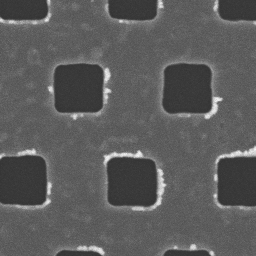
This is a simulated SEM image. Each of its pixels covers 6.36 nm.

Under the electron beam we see holes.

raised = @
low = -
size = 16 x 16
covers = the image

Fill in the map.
---@@@@---@@@@--
@@@@@@@@@@@@@@@@
@@@@@@@@@@@@@@@@
@@@@@@@@@@@@@@@@
@@@---@@@@---@@@
@@@---@@@@---@@@
@@@---@@@@---@@@
@@@@@@@@@@@@@@@@
@@@@@@@@@@@@@@@@
@@@@@@@@@@@@@@@@
---@@@@---@@@@--
---@@@@---@@@@--
---@@@@---@@@@--
@@@@@@@@@@@@@@@@
@@@@@@@@@@@@@@@@
@@@@@@@@@@@@@@@@